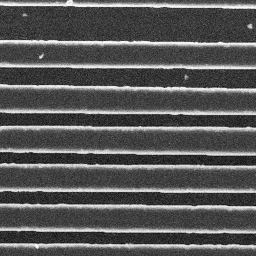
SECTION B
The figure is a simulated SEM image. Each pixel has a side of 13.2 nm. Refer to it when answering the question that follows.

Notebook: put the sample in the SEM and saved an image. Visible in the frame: lines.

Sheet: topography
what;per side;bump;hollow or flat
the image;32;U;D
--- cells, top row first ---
UUUUUUUUUUUUUUUUUUUUUUUUUUUUUUUU
DDDDDDDDDDDDDDDDDDDDDDDDDDDDDDDD
DDDDDDDDDDDDDDDDDDDDDDDDDDDDDDDD
DDDDDDDDDDDDDDDDDDDDDDDDDDDDDDDD
DDDDDDDDDDDDDDDDDDDDDDDDDDDDDDDD
UUUUUUUUUUUUUUUUUUUUUUUUUUUUUUUU
UUUUUUUUUUUUUUUUUUUUUUUUUUUUUUUU
UUUUUUUUUUUUUUUUUUUUUUUUUUUUUUUU
DDDDDDDDDDDDDDDDDDDDDDDDDDDDUUUU
DDDDDDDDDDDDDDDDDDDDDDDDDDDDDDDD
DDDDDDDDDDDDDDDDDDDDDDDDDDDDDDDD
UUUUUUUUUUUUUUUUUUUUUUUUUUUUUUUU
UUUUUUUUUUUUUUUUUUUUUUUUUUUUUUUU
UUUUUUUUUUUUUUUUUUUUUUUUUUUUUUUU
DDDDDDDDDDDDDDDDDDDDDDDDDDDDDDDD
DDDDDDDDDDDDDDDDDDDDDDDDDDDDDDDD
UUUUUUUUUUUUUUUUUUUUUUUUUUUUUUUU
UUUUUUUUUUUUUUUUUUUUUUUUUUUUUUUU
UUUUUUUUUUUUUUUUUUUUUUUUUUUUUUUU
DDDDDDDDDDDDDDDDDDDDDDDDDDDDDDDD
DDDDDDDDDDDDDDDDDDDDDDDDDDDDDDDD
UUUUUUUUUUUUUUUUUUUUUUUUUUUUUUUU
UUUUUUUUUUUUUUUUUUUUUUUUUUUUUUUU
UUUUUUUUUUUUUUUUUUUUUUUUUUUUUUUU
DDDDDDDDDDDDDDDDDDDDDDDDDDDDDDDD
DDDDDDDDDDDDDDDDDDDDDDDDDDDDDDDD
UUUUUUUUUUUUUUUUUUUUUUUUUUUUUUUU
UUUUUUUUUUUUUUUUUUUUUUUUUUUUUUUU
UUUUUUUUUUUUUUUUUUUUUUUUUUUUUUUU
DDDDDDDDDDDDDDDDDDDDDDDDDDDDDDDD
DDDDDDDDDDDDDDDDDDDDDDDDDDDDDDDD
UUUUUUUUUUUUUUUUUUUUUUUUUUUUUUUU